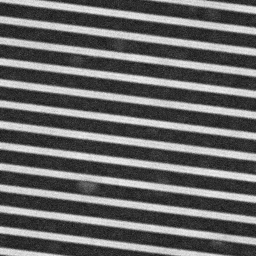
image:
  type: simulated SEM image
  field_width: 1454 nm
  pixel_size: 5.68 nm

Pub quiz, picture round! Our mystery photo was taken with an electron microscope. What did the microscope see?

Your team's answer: parallel lines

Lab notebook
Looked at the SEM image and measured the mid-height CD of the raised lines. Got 31.7 nm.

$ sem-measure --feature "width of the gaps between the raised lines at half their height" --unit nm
83.8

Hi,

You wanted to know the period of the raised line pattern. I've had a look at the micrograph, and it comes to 118 nm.